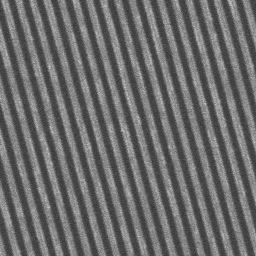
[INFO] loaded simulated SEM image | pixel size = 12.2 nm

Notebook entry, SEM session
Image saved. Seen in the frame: parallel lines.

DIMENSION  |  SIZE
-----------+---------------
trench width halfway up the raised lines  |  92.3 nm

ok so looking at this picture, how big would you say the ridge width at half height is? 0.0689 µm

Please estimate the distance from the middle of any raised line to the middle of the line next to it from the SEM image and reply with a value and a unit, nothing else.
0.167 µm